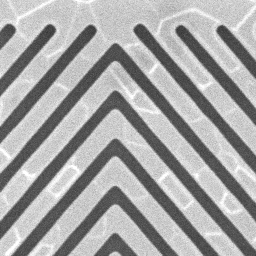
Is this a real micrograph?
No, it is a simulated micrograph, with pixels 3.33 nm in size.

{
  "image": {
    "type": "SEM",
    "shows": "groups of lines, slits or small figures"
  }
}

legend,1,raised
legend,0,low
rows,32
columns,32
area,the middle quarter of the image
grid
01111110000111000011111110000111
11111100001111100001111111000011
11111000011111110000111111000001
11110000011111111000011111100000
11110000111111111100001111110000
11100001111111111110000111111000
11000011111111111111000011111100
10000111111000111111100001111110
00001111111000011111100000111111
00011111110000001111110000111111
00011111100000000111111000011111
00111111000011000011111100001111
01111110000111100001111110000111
11111100001111100000111111000011
11111000011111110000111111100001
11110000111111111000011111100000
11110000111111111100001111110000
11100001111111111110000111111000
11000011111111111111000011111100
10000111111000111111100001111110
00001111111000011111100000111111
00011111110000001111110000111111
00111111100000000111111000011111
00111111000011000011111100001111
01111110000111100001111110000111
11111100001111100000111111000011
11111000011111110000011111100001
11110000011111111000011111110000
11100000111111111100001111110000
11100001111111111110000111111000
11000011111101111111000011111100
10000111111000111111100001111110